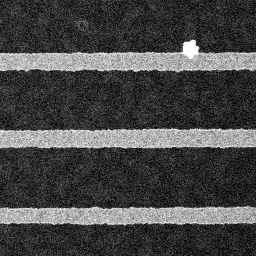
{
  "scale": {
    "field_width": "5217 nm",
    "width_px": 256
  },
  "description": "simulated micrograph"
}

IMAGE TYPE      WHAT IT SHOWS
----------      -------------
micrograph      one or a few lines or trenches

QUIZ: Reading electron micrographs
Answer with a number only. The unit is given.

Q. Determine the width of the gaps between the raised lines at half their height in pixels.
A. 60.2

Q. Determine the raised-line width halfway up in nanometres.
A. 331